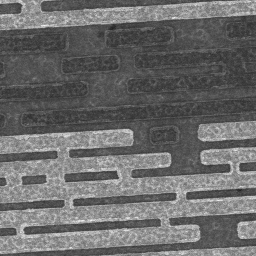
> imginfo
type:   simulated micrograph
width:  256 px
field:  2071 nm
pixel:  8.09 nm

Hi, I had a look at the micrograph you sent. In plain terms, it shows parallel lines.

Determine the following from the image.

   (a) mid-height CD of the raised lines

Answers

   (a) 126 nm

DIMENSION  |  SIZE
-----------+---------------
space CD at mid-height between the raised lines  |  71.7 nm